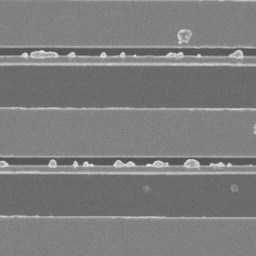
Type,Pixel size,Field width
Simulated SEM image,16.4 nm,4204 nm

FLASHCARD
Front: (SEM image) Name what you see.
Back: lines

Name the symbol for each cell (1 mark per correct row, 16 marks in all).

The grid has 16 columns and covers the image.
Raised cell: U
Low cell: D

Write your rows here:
UUUUUUUUUUUUUUUU
UUUUUUUUUUUUUUUU
UUUUUUUUUUUUUUUU
UUUUUUUUUUUUUUUU
DDDDDDDDDDDDDDDD
DDDDDDDDDDDDDDDD
DDDDDDDDDDDDDDDD
UUUUUUUUUUUUUUUU
UUUUUUUUUUUUUUUU
UUUUUUUUUUUUUUUU
UUUUUUUUUUUUUUUU
DDDDDDDDDDDDDDDD
DDDDDDDDDDDDDDDD
DDDDDDDDDDDDDDDD
UUUUUUUUUUUUUUUU
UUUUUUUUUUUUUUUU